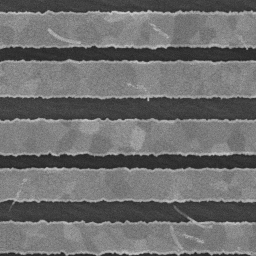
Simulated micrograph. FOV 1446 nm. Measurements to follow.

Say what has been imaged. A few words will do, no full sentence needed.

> lines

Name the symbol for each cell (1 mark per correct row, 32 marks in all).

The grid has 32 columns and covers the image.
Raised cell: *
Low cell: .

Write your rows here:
................................
......*....*..*...**..***..*..**
********************************
********************************
********************************
********************************
................................
........*.......................
********************************
********************************
********************************
********************************
................................
................................
................................
********************************
********************************
********************************
********************************
................................
................................
********************************
********************************
********************************
********************************
................................
................................
................................
********************************
********************************
********************************
********************************